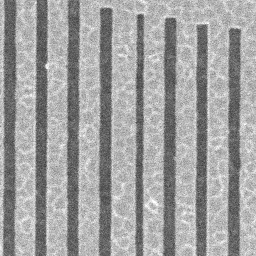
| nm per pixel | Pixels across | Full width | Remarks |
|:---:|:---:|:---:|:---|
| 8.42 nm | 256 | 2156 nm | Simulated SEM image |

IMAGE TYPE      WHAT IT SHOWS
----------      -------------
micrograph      parallel lines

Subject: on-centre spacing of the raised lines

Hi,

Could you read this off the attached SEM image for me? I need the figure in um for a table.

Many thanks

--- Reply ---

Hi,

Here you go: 0.27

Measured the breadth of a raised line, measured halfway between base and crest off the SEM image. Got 164 nanometers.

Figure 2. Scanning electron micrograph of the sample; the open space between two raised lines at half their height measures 0.107 micrometres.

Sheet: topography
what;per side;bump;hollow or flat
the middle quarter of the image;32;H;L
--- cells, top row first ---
LLLLHHHHHLLLHHHHHHLLHHHHHLLLHHHH
HLLLHHHHHLLLHHHHHHLLHHHHHLLLHHHH
HLLLHHHHHLLLHHHHHHLLHHHHHLLLHHHH
HLLLHHHHHLLLHHHHHHLLHHHHHLLLHHHH
HLLLHHHHHLLLHHHHHHLLHHHHHLLLHHHH
HLLLHHHHHLLLHHHHHHLLHHHHHLLLHHHH
HLLLHHHHHLLLHHHHHHLLHHHHHLLLHHHH
HLLLHHHHHLLLHHHHHHLLHHHHHLLLHHHH
HLLLHHHHHLLLHHHHHHLLHHHHHLLLHHHH
HLLLHHHHHLLLHHHHHHLLHHHHHLLLHHHH
HLLLHHHHHLLLHHHHHHLLHHHHHLLLHHHH
HLLLHHHHHLLLHHHHHHLLHHHHHLLLHHHH
HLLLHHHHHLLLHHHHHHLLHHHHHLLLHHHH
HLLLHHHHHLLLHHHHHHLLHHHHHLLLHHHH
HLLLHHHHHLLLHHHHHHLLHHHHHLLLHHHH
HLLLHHHHHLLLHHHHHHLLHHHHHLLLHHHH
HLLLHHHHHLLLHHHHHHLLHHHHHLLLHHHH
HLLLHHHHHLLLHHHHHHLLHHHHHLLLHHHH
HLLLHHHHHLLLHHHHHHLLHHHHHLLLHHHH
HLLLHHHHHLLLHHHHHHLLHHHHHLLLHHHH
HLLLHHHHHLLLHHHHHHLLHHHHHLLLHHHH
HLLLHHHHHLLLHHHHHHLLHHHHHLLLHHHH
HLLLHHHHHLLLHHHHHHLLHHHHHLLLHHHH
HLLLHHHHHLLLHHHHHHLLHHHHHLLLHHHH
HLLLHHHHHLLLHHHHHHLLHHHHHLLLHHHH
HLLLHHHHHLLLHHHHHHLLHHHHHLLLHHHH
HLLLHHHHHLLLHHHHHHLLHHHHHLLLHHHH
HLLLHHHHHLLLHHHHHHLLHHHHHLLLHHHH
HLLLHHHHHLLLHHHHHHLLHHHHHLLLHHHH
HLLLHHHHHLLLHHHHHHLLHHHHHLLLHHHH
HLLLHHHHHLLLHHHHHHLLHHHHHLLLHHHH
HLLLHHHHHLLLHHHHHHLLHHHHHLLLHHHH